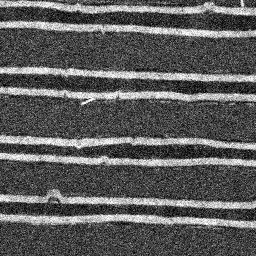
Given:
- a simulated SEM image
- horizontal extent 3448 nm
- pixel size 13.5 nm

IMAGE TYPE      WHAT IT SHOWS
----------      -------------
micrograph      one or a few lines or trenches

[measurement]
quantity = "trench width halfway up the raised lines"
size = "603 nm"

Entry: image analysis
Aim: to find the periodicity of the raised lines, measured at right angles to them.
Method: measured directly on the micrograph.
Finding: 862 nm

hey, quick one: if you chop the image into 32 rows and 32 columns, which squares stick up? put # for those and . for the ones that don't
##..............................
################################
################################
............###.################
................................
................................
................................
................................
................................
##################..............
################################
...#############################
................................
................................
................................
................................
................................
##.............#................
################################
################################
................................
................................
................................
................................
......#.........................
########################........
################################
....................###.########
................................
................................
................................
................................